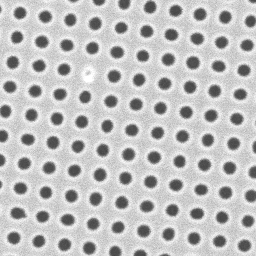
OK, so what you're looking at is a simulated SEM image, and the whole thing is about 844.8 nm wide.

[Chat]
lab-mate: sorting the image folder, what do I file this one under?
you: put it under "a regular array of holes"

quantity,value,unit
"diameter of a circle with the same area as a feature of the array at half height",42.5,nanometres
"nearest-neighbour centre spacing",81.1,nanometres